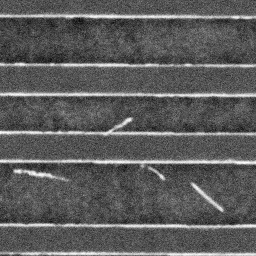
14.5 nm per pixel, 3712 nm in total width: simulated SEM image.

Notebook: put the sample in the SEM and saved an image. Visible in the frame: lines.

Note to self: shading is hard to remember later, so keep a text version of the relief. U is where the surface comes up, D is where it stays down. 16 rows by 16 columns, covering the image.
UUUUUUUUUUUUUUUU
DDDDDDDDDDDDDDDD
DDDDDDDDDDDDDDDD
DDDDDDDDDDDDDDDD
UUUUUUUUUUUUUUUU
UUUUUUUUUUUUUUUU
DDDDDDDDDDDDDDDD
DDDDDDDDDDDDDDDD
UUUUUUUUUUUUUUUU
UUUUUUUUUUUUUUUU
DDDDDDDDDDDDDDDD
DDDDDDDDDDDDDDDD
DDDDDDDDDDDDDDDD
DDDDDDDDDDDDDDDD
UUUUUUUUUUUUUUUU
UUUUUUUUUUUUUUUU